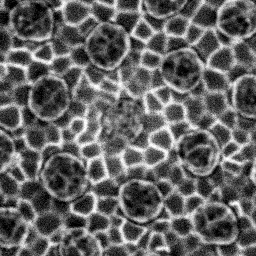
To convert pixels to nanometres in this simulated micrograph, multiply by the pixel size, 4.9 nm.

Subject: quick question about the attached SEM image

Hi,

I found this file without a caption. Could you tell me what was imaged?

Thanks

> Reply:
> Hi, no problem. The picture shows raised bodies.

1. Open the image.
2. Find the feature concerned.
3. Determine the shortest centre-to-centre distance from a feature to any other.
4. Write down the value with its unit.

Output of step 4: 0.384 microns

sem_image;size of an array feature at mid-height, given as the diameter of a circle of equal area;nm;209